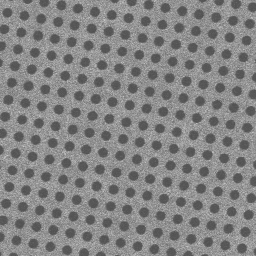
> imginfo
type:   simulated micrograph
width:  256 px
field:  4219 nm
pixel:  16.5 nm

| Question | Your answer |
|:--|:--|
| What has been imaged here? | a regular array of holes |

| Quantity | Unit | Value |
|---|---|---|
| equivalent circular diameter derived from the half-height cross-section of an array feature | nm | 165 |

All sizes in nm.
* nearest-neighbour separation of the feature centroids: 279